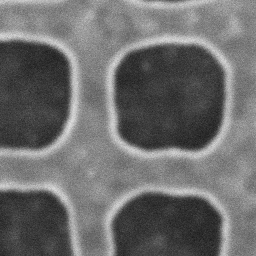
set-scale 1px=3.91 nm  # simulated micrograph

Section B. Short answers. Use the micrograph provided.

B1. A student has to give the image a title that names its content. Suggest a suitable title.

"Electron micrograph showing holes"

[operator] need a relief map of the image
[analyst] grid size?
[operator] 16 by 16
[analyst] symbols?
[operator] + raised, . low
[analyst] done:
++++++++++++++++
++++++++++++++++
..++++++++++++++
....++++.....+++
....+++.......++
.....++.......++
....+++.......++
....+++.......++
....+++.......++
++++++++++++++++
++++++++++++++++
++++++++++++++++
....++++.....+++
....+++.......++
....+++.......++
.....++.......++